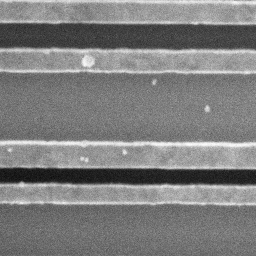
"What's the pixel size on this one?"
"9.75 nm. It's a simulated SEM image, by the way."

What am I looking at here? lines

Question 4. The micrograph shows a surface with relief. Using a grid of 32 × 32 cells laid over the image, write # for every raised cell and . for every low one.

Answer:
################################
################################
################################
................................
................................
................................
################################
################################
################################
................................
................................
................................
................................
................................
................................
................................
................................
................................
################################
################################
################################
................................
................................
################################
################################
...................#.....#.#####
................................
................................
................................
................................
................................
................................